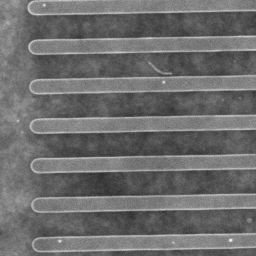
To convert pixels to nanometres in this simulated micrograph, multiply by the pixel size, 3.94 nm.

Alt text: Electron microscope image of groups of lines, slits or small figures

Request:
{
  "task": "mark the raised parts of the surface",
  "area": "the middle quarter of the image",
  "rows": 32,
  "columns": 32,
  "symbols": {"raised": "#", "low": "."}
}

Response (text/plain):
................................
................................
................................
.................###############
################################
################################
################################
................................
................................
................................
................................
................................
................................
......##########################
################################
################################
###############################.
................................
................................
................................
................................
................................
................................
........########################
################################
################################
###############################.
................................
................................
................................
................................
................................